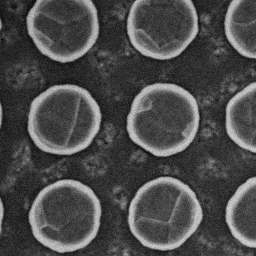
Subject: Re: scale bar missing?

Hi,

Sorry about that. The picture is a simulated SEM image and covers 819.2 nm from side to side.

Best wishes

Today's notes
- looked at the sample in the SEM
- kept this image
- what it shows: raised bodies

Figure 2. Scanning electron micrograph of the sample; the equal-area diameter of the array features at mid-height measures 220 nm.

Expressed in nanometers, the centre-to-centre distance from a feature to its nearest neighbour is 305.